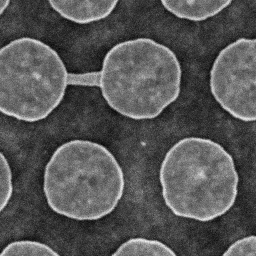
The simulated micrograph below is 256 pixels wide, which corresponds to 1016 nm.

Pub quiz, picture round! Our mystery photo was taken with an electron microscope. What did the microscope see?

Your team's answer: raised bodies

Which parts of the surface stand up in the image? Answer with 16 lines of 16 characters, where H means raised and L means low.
LLLHHHHLLLLHHHLL
LLLLLLLLLLLLLLLL
LHLLLLLLLLLLLLLH
HHHHLLLHHHHLLLHH
HHHHLLHHHHHLLHHH
HHHHLLHHHHHLLHHH
HHHHLLLHHHHLLLHH
LLLLLLLLLLLLLLLL
LLLLLLLLLLLLLLLL
LLLLHHHLLLLHHHLL
HLLHHHHLLLHHHHHL
HLLHHHHHLLHHHHHL
LLLHHHHLLLHHHHHL
LLLLHHLLLLLLHHLL
LLLLLLLLLLLLLLLL
HHHLLLLLHHLLLLHH